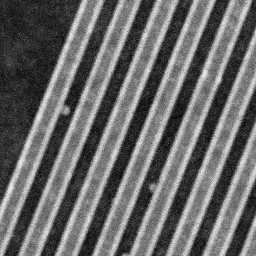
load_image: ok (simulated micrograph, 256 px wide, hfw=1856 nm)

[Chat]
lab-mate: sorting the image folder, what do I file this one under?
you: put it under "parallel lines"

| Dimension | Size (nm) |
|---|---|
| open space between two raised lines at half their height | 137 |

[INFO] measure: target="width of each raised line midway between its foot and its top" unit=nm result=115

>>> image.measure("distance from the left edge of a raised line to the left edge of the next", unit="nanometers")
249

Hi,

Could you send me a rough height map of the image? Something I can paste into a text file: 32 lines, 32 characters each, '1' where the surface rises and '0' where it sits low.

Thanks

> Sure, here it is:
00000000001110011000110011000110
00000000001100011001100011000110
00000000001100110001100011001100
00000000011000110011100110001100
00000000011000100011000110011000
00000000111001100011001100011000
00000000110001100110001100011001
00000000110011000110001100110001
00000001100011001110011000110011
00000001100011001100011001100011
00000011100110001100110001100011
00000011000110011000110001100110
00000011001100011000110011000110
00000110001100011001100011001100
00000110001100110001100111001100
00001110011000110011000110001100
00001100011001100011000110011000
00001100110001100011001100011001
00011000110001100110001100111001
00011000110011000110011000110001
00111001100011001100011000110011
00110001100110001100011001100011
00110011000110001100110001100110
01100011000110011000110011100110
01100011001100011001110011000110
11100110001100110001100011001100
11000110011000110001100110001100
11001100011000110011000110011100
10001100011001100011001110011000
10001100110001100111001100011001
10011000110011000110001100110001
00011001110011000110011000110001